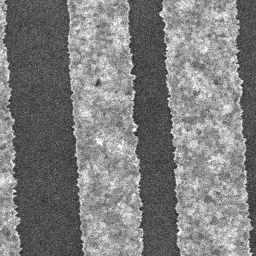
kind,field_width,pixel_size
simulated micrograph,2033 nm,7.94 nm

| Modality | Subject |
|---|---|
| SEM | one or a few lines or trenches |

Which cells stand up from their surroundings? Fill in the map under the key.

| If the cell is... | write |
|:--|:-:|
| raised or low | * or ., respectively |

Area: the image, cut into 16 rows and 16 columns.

....****..*****.
....****..*****.
....****..*****.
....****..*****.
*...****..*****.
*...****...****.
*....***...****.
*....***...****.
*....***...****.
*....***...****.
*....****..****.
*....****..****.
*....****..****.
*....****..*****
*....****..*****
*....****..*****